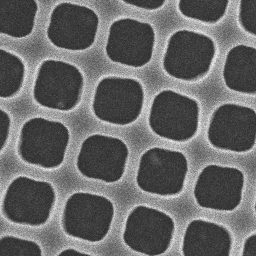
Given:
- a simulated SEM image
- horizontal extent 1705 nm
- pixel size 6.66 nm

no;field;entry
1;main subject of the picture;a regular array of holes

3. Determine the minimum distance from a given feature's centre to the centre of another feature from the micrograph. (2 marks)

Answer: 395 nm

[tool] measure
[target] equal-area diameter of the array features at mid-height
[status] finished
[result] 0.333 micrometres